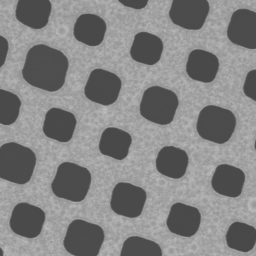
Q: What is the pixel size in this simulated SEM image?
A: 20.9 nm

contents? a regular array of holes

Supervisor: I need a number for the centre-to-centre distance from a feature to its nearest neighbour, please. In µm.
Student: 1.22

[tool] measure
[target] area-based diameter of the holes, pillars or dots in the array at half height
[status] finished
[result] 713 nm